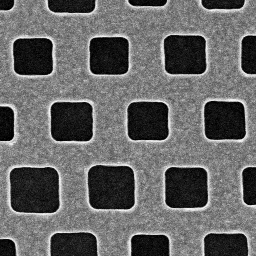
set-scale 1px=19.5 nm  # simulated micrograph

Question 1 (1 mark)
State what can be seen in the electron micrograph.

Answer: a regular array of holes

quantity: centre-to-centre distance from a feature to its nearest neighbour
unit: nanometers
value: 1470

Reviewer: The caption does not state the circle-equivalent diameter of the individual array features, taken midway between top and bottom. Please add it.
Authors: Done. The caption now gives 878 nm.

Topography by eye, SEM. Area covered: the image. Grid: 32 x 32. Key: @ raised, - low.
--@@@@------@@@@-----@@@@-----@@
@@@@@@@----@@@@@@@@@@@@@@@@@@@@@
@@@@@@@@@@@@@@@@@@@@@@@@@@@@@@@@
@@@@@@@@@@@@@@@@@@@@@@@@@@@@@@@@
@@@@@@@@@@@@@@@@@@@@@----@@@@@@-
@@----@@@@@-----@@@@------@@@@--
@@-----@@@@-----@@@@------@@@@--
@@-----@@@@-----@@@@------@@@@--
@@-----@@@@-----@@@@@-----@@@@--
@@@--@@@@@@@@@@@@@@@@@@@@@@@@@@@
@@@@@@@@@@@@@@@@@@@@@@@@@@@@@@@@
@@@@@@@@@@@@@@@@@@@@@@@@@@@@@@@@
@@@@@@@@@@@@@@@@@@@@@@@@@@@@@@@@
-@@@@@------@@@@-----@@@@@-----@
--@@@@------@@@@-----@@@@------@
--@@@@------@@@@-----@@@@------@
--@@@@------@@@@-----@@@@@-----@
-@@@@@@----@@@@@@---@@@@@@@---@@
@@@@@@@@@@@@@@@@@@@@@@@@@@@@@@@@
@@@@@@@@@@@@@@@@@@@@@@@@@@@@@@@@
@@@@@@@@@@@@@@@@@@@@@@@@@@@@@@@@
@------@@@@------@@@@-----@@@@--
@------@@@@------@@@@-----@@@@--
@------@@@@------@@@@-----@@@@--
@------@@@@------@@@@-----@@@@--
@------@@@@------@@@@-----@@@@@-
@@@----@@@@@@@@@@@@@@@@@@@@@@@@@
@@@@@@@@@@@@@@@@@@@@@@@@@@@@@@@@
@@@@@@@@@@@@@@@@@@@@@@@@@@@@@@@@
@@@@@@@-----@@@@@----@@@@@-----@
--@@@@------@@@@-----@@@@------@
--@@@@------@@@@-----@@@@@-----@